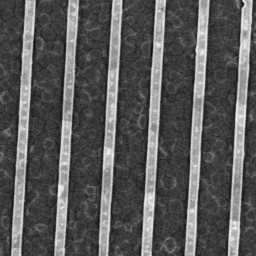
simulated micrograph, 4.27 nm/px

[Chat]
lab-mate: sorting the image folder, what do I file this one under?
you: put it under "parallel lines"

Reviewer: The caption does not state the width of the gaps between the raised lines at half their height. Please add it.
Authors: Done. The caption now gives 148 nm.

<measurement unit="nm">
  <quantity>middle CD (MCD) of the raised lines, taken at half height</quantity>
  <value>37.3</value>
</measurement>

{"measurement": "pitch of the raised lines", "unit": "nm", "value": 185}